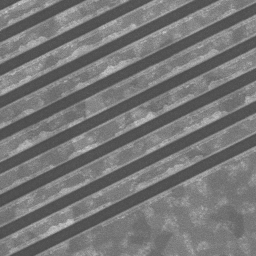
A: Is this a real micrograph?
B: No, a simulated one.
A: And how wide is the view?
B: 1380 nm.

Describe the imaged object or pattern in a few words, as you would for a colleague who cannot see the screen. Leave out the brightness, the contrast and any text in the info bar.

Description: parallel lines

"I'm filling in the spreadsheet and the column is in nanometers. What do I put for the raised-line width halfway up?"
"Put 93.6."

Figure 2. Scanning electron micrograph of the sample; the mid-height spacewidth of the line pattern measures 67 nm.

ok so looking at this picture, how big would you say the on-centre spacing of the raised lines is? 29.3 pixels